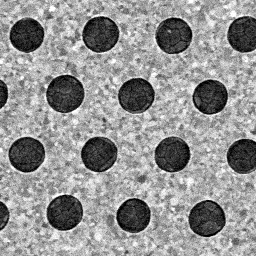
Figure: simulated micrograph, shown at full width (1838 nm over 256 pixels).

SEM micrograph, a regular array of holes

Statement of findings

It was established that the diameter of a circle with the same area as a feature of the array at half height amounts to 267 nm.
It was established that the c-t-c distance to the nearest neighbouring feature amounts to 496 nm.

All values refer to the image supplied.